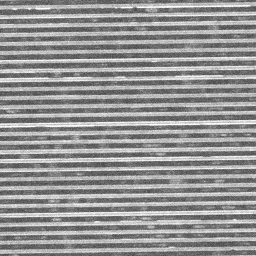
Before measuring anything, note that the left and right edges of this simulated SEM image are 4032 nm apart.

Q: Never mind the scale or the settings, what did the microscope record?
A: parallel lines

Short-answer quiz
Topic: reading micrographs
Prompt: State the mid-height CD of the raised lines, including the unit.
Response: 47.2 nanometers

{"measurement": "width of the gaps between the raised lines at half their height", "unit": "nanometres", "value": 94.5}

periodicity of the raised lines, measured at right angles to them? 142 nm